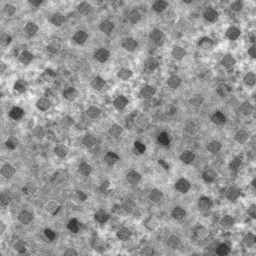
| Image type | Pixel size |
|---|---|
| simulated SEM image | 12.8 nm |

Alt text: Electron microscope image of a regular array of raised bodies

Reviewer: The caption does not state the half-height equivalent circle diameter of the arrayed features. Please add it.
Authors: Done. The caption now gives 196 nm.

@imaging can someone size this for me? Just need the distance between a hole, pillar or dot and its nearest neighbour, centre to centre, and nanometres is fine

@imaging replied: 366